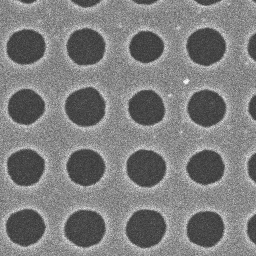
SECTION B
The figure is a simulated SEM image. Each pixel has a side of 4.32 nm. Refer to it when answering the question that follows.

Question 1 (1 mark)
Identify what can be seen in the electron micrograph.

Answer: a regular array of holes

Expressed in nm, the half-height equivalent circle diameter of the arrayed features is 166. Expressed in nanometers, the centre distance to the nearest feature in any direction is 258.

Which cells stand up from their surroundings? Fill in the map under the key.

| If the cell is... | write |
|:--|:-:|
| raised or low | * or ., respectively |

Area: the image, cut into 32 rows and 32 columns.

**********..*****..******..*****
********************************
********************************
*************************.******
*....****....****...****....***.
*.....**.....***.....**.....***.
*.....**.....***....***.....***.
*....****....****...****...*****
********************************
********************************
********************************
**..*****...*****..*****...*****
*....***.....***....****....***.
*.....**.....***.....**.....***.
*....***.....***.....***....***.
**..*****...*****..******..*****
********************************
********************************
********************************
*....****....***....****....****
*.....**.....***.....**.....***.
*....***.....***.....**.....***.
*....****...****....****...*****
********************************
********************************
********************************
**...****...*****...*****..*****
*....***.....***.....***....***.
*.....**.....***.....**.....***.
*....***.....***.....**.....***.
**..*****...*****...****...*****
********************************